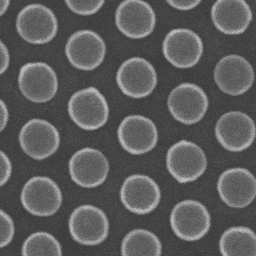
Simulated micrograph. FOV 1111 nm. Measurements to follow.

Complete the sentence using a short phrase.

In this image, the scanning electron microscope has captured a regular array of raised bodies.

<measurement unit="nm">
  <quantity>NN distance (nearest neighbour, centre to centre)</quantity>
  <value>240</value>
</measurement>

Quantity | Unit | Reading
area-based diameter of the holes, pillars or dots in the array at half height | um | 0.169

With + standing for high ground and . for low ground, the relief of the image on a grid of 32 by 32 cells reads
+.......+++++..+++...++++..++++.
...+++...+++...++++.......+++++.
..+++++........++++........++++.
..+++++........++++........++++.
...++++..+++....++...++++.......
........+++++.......+++++.......
+.......+++++........++++.......
+........++++...++...++++...+++.
+..+++....++...++++........++++.
..+++++........++++........+++++
..+++++........++++........++++.
...++++...++...++++...+++...++..
....++...++++........+++++......
+........++++........+++++......
+........++++.........+++...+++.
+..+++....+++..++++........+++++
...++++........+++++.......+++++
...++++........+++++.......+++++
...++++.........+++..++++...+++.
+...++...++++........+++++......
+........++++........+++++......
+........++++........++++...+++.
+...++...++++...+++...++...+++++
...++++........+++++.......+++++
...+++++.......+++++........++++
...++++........+++++..+++...+++.
....+++..++++....+....++++......
+........++++........+++++......
++.......++++.........++++......
++..++...++++...+++...+++...++++
+..++++........+++++........++++
...+++++.......+++++........++++